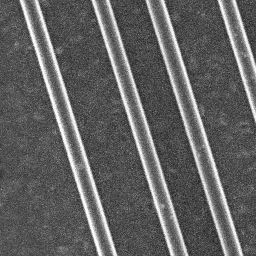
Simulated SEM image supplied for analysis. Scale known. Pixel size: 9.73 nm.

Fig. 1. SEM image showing parallel lines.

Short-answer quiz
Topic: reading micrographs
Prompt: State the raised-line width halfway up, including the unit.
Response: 143 nanometers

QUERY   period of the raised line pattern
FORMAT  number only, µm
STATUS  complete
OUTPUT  0.592